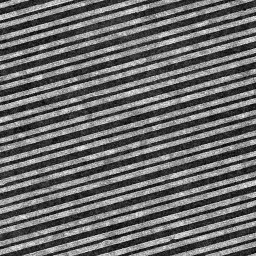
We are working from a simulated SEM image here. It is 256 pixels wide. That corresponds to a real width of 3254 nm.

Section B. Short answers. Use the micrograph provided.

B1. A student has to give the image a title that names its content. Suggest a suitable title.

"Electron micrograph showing parallel lines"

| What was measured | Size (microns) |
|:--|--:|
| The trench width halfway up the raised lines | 0.0591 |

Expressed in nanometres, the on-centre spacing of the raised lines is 126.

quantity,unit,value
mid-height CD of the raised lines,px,4.46